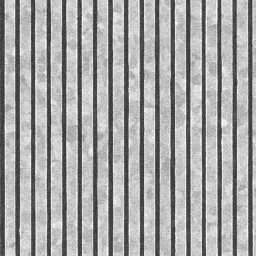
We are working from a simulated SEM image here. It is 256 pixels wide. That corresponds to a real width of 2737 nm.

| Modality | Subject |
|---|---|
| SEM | parallel lines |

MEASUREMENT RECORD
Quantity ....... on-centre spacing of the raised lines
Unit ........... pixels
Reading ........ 15.5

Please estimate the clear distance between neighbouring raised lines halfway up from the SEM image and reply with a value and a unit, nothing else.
4.87 pixels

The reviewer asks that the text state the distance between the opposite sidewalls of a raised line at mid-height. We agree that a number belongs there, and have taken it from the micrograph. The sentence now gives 10.2 pixels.